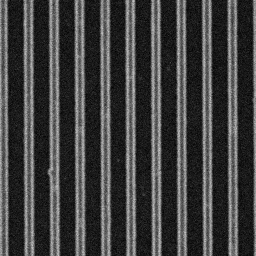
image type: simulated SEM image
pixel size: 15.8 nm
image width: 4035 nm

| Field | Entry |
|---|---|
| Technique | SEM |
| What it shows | parallel lines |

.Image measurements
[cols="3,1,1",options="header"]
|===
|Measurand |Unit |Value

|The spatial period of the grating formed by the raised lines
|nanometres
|402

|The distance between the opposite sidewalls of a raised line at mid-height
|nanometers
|124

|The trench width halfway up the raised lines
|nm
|278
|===